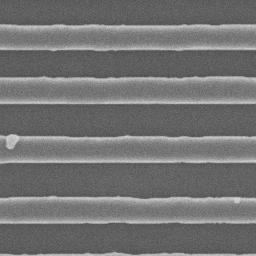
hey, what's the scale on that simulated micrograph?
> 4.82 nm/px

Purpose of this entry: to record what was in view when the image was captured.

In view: lines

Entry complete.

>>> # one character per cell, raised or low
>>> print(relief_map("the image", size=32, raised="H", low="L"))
LLLLLLLLLLLLLLLLLLLLLLLLLLLLLLLL
LLLLLLLLLLLLLLLLLLLLLLLLLLLLLLLL
LLLLLLLLLLLLLLLLLLLLLLLLLLLLLLLL
HHHHHHHHHHHHHHHHHHHHHHHHHHHHHHHH
HHHHHHHHHHHHHHHHHHHHHHHHHHHHHHHH
HHHHHHHHHHHHHHHHHHHHHHHHHHHHHHHH
LLLLLLLLLLLLLLLLLLLLLLLLLLLLLLLL
LLLLLLLLLLLLLLLLLLLLLLLLLLLLLLLL
LLLLLLLLLLLLLLLLLLLLLLLLLLLLLLLL
LLLLLLLLLLLLLLLLLLLLLLLLLLLLLLLL
HHHHHHHHHHHHHHHHHHHHHHHHHHHHHHHH
HHHHHHHHHHHHHHHHHHHHHHHHHHHHHHHH
HHHHHHHHHHHHHHHHHHHHHHHHHHHHHHHH
LLLLLLLLLLLLLLLLLLLLLLLLLLLLLLLL
LLLLLLLLLLLLLLLLLLLLLLLLLLLLLLLL
LLLLLLLLLLLLLLLLLLLLLLLLLLLLLLLL
LLLLLLLLLLLLLLLLLLLLLLLLLLLLLLLL
HHHHHHHHHHHHHHHHHHHHHHHHHHHHHHHH
HHHHHHHHHHHHHHHHHHHHHHHHHHHHHHHH
HHHHHHHHHHHHHHHHHHHHHHHHHHHHHHHH
LLLLLLLLLLLLLLLLLLLLLLLLLLLLLLLL
LLLLLLLLLLLLLLLLLLLLLLLLLLLLLLLL
LLLLLLLLLLLLLLLLLLLLLLLLLLLLLLLL
LLLLLLLLLLLLLLLLLLLLLLLLLLLLLLLL
LLLLLLLLLLLLLLLLLLLLLLLLLLLLLLLL
HHHHHHHHHHHHHHHHHHHHHHHHHHHHHHHH
HHHHHHHHHHHHHHHHHHHHHHHHHHHHHHHH
HHHHHHHHHHHHHHHHHHHHHHHHHHHHHHHH
LLLLLLLLLLLLLLLLLLLLLLLLLLLLLLLL
LLLLLLLLLLLLLLLLLLLLLLLLLLLLLLLL
LLLLLLLLLLLLLLLLLLLLLLLLLLLLLLLL
LLLLLLLLLLLLLLLLLLLLLLLLLLLLLLLL